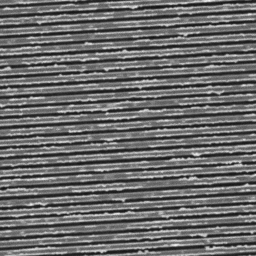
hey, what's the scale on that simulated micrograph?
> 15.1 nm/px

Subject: parallel lines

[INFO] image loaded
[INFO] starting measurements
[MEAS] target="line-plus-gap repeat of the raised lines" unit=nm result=152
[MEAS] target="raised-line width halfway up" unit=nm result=94.3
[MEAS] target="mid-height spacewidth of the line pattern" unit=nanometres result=54.7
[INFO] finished